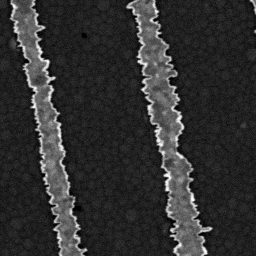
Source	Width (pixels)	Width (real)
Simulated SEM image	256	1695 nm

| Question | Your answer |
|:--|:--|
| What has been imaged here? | one or a few lines or trenches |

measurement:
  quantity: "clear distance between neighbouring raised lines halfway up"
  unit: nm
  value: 633